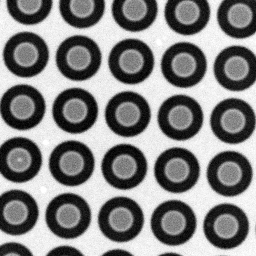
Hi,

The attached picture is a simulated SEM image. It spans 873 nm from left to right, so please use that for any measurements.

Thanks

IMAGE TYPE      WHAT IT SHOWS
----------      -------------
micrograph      an array of small figures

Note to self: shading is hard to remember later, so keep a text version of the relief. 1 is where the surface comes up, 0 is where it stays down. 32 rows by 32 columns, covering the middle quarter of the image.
00111100011000111110001100011111
00000000011000011110001100011111
00000000111100000000001110001111
10000001111110000000011110000000
11111111111111000000111111000000
11111111111111111111111111100000
00000111111111111111111111111111
00000001111110000001111111111111
00000000111100000000111111000000
01111000111000000000011110000000
11111000111000111100011100000000
11111100010001111110001100011110
11111100010001111110001000111111
01111000110001111110001000111111
00000000111000111100011000111111
00000001111000000000011100011110
00000011111100000000111100000000
11011111111110000001111110000000
11111111111111111111111111000000
00001111111111111111111111111111
00000011111110000111111111111111
00000001111000000001111110000001
11100001110000000000111100000000
11110000110001111000011000000000
11111000100011111100011000111100
11111000100011111100011000111110
11110001100011111100010001111110
01100001110001111000111000111110
00000011110000000000111000111100
00000111111000000000111000000000
10011111111100000011111100000000
11111111111111001111111110000001